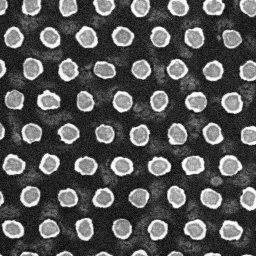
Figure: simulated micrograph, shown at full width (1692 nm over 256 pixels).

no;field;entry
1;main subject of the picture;a regular array of raised bodies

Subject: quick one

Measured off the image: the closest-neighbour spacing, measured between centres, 233 nanometers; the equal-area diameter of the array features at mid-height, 121 nm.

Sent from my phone